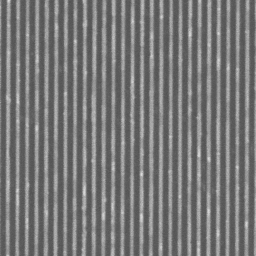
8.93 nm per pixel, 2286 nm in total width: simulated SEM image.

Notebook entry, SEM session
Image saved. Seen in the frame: parallel lines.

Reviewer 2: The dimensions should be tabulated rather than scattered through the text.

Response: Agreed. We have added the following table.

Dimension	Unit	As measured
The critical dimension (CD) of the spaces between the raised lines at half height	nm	60.3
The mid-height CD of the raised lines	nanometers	24.6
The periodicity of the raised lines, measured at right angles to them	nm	85.3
